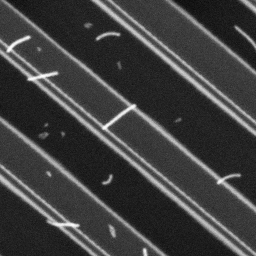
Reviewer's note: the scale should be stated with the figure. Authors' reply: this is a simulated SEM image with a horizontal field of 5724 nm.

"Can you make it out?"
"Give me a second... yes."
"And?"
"lines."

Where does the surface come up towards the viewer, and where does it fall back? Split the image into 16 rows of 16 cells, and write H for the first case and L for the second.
HLLLLLLHHHHLLLLL
HHLLLLLLHHHHLLLL
HHHLLLLLLHHHHLLL
HHHHLLLLLLHHHHHL
LHHHHHLLLLLHHHHH
LLLHHHHLLLLLLHHH
LLLLHHHHLLLLLLHH
LLLLLHHHHLLLLLLH
HLLLLLHHHHLLLLLL
HHLLLLLHHHHHLLLL
HHHHLLLLLHHHHLLL
LHHHHLLLLLHHHHLL
LLHHHHLLLLLHHHHL
LLLHHHHLLLLLHHHH
LLLLHHHHLLLLLHHH
LLLLLHHHHHLLLLLH